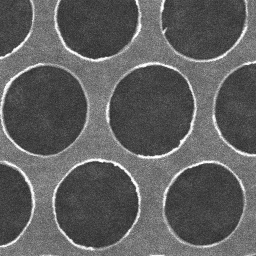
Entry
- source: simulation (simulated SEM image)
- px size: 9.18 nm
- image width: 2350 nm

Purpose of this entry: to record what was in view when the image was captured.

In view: holes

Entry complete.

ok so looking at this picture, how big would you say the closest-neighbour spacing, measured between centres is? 983 nanometres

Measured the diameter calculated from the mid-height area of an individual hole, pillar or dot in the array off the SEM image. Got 793 nm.